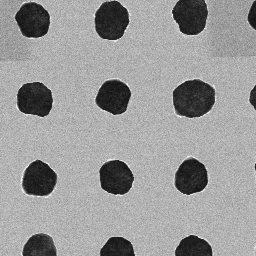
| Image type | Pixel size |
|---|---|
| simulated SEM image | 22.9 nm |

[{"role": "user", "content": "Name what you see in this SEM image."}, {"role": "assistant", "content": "holes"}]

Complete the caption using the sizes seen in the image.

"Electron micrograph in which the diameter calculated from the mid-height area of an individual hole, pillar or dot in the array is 796 nanometres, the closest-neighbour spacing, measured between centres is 1.81 um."